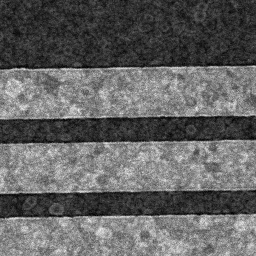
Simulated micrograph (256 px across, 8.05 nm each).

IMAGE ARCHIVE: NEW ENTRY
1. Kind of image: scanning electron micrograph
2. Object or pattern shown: one or a few lines or trenches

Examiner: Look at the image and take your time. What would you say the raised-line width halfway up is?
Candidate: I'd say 0.393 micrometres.